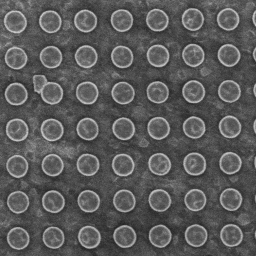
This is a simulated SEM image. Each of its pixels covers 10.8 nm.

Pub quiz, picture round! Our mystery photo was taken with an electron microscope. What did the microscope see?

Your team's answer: a regular array of raised bodies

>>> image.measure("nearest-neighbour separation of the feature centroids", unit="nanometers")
381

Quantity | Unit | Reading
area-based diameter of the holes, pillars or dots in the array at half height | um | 0.228